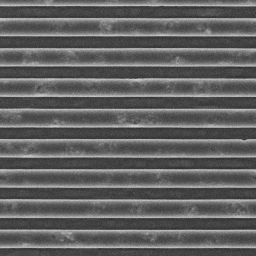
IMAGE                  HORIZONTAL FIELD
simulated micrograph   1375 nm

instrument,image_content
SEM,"parallel lines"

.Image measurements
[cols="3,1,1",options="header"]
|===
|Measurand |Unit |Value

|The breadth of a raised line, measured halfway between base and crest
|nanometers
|95.9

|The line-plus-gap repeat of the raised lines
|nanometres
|162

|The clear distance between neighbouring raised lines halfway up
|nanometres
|65.7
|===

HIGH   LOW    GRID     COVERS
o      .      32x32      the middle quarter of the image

................................
................................
................................
................................
oooooooooooooooooooooooooooooooo
oooooooooooooooooooooooooooooooo
oooooooooooooooooooooooooooooooo
oooooooooooooooooooooooooooooooo
................................
................................
................................
oooooooooooooooooooooooooooooooo
oooooooooooooooooooooooooooooooo
oooooooooooooooooooooooooooooooo
oooooooooooooooooooooooooooooooo
oooooooooooooooooooooooooooooooo
................................
................................
................................
oooooooooooooooooooooooooooooooo
oooooooooooooooooooooooooooooooo
oooooooooooooooooooooooooooooooo
oooooooooooooooooooooooooooooooo
................................
................................
................................
..............oooooooooooooo..oo
oooooooooooooooooooooooooooooooo
oooooooooooooooooooooooooooooooo
oooooooooooooooooooooooooooooooo
oooooooooooooooooooooooooooooooo
................................